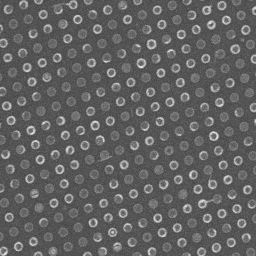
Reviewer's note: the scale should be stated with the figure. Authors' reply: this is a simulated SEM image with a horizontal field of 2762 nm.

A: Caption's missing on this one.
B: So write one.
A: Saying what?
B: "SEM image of a regular array of raised bodies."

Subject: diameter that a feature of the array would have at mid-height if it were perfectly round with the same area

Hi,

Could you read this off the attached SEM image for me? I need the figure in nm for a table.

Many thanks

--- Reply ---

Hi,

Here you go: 91.1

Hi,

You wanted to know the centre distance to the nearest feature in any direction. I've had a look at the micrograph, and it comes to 164 nanometres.